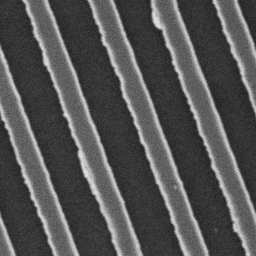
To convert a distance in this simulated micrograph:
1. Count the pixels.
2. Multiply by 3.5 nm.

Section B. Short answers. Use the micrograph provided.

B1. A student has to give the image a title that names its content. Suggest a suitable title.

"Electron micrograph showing lines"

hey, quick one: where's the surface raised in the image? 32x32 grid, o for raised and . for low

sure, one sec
...ooo.....ooo.....ooo.....ooo..
...ooo......ooo....ooo.....ooo..
....ooo.....ooo....oooo.....ooo.
....ooo.....ooo.....ooo.....ooo.
....oooo.....ooo.....ooo....ooo.
.....ooo.....ooo.....ooo.....ooo
.....ooo......ooo....ooo.....ooo
o.....ooo.....ooo.....ooo.....oo
o.....ooo.....ooo.....ooo.....oo
o.....oooo.....ooo....ooo.....oo
oo.....ooo.....ooo.....ooo.....o
oo.....ooo.....ooo.....ooo.....o
ooo.....ooo.....ooo....oooo....o
ooo.....ooo.....ooo.....ooo.....
ooo.....ooo......ooo....ooo.....
.ooo.....ooo.....ooo.....ooo....
.ooo.....ooo.....ooo.....ooo....
.ooo.....ooo......ooo....ooo....
..ooo.....ooo.....ooo.....ooo...
..ooo.....ooo.....ooo.....ooo...
..ooo.....ooo......ooo....oooo..
...ooo....oooo.....ooo.....ooo..
...ooo.....ooo......ooo....ooo..
....ooo.....ooo.....ooo.....ooo.
....ooo.....ooo.....ooo.....ooo.
....ooo.....ooo......ooo.....oo.
.....ooo.....ooo.....ooo.....ooo
.....ooo.....ooo.....ooo.....ooo
o.....ooo.....ooo.....ooo....ooo
o.....ooo.....ooo.....ooo.....oo
o.....ooo.....ooo......ooo....oo
oo.....ooo.....ooo.....ooo.....o